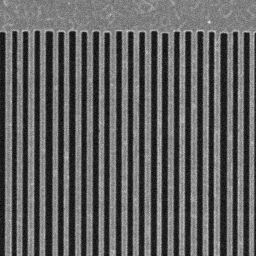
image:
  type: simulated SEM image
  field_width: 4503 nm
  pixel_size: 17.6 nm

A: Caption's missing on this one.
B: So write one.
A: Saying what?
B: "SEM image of parallel lines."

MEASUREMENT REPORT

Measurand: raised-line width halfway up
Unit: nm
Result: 79.2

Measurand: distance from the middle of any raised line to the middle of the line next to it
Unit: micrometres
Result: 0.204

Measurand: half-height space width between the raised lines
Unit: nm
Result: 121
